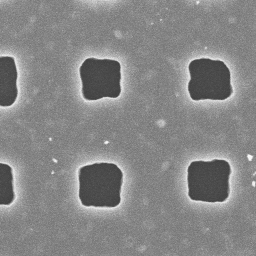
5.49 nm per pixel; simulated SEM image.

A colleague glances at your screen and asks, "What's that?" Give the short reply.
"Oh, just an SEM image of holes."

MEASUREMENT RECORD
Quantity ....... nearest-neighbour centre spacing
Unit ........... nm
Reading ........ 568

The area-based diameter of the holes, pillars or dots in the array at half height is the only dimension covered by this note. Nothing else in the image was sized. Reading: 248 nm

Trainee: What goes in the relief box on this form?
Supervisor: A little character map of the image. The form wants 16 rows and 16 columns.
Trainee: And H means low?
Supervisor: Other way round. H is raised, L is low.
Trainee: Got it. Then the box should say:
HHHHHHHHHHHHHHHH
HHHHHHHHHHHHHHHH
HHHHHHHHHHHHHHHH
HHHHHHHHHHHHHHHH
LHHHHLLLHHHHLLHH
LHHHHLLLHHHHLLHH
LHHHHHHHHHHHHHHH
HHHHHHHHHHHHHHHH
HHHHHHHHHHHHHHHH
HHHHHHHHHHHHHHHH
LHHHHLLHHHHHLLHH
LHHHHLLLHHHHLLHH
LHHHHLLHHHHHLLHH
HHHHHHHHHHHHHHHH
HHHHHHHHHHHHHHHH
HHHHHHHHHHHHHHHH